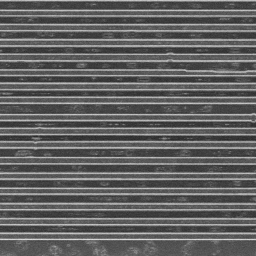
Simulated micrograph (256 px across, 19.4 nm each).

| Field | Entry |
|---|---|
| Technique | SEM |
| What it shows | parallel lines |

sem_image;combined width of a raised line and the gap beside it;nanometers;289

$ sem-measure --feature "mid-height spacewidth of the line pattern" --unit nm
170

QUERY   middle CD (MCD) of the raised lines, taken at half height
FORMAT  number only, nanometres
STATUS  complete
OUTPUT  119